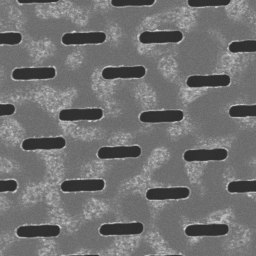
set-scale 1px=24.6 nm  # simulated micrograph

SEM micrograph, a regular array of holes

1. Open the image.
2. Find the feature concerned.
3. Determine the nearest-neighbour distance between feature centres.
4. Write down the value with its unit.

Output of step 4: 1.32 micrometres